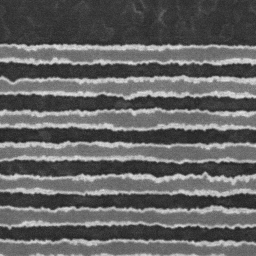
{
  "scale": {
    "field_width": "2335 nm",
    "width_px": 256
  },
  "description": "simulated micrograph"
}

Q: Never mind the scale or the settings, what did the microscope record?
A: parallel lines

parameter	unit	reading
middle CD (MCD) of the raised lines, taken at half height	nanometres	145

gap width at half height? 153 nm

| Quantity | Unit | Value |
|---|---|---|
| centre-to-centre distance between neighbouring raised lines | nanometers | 297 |